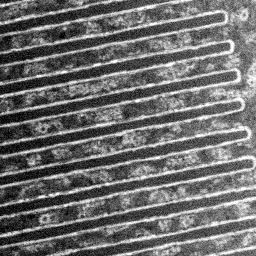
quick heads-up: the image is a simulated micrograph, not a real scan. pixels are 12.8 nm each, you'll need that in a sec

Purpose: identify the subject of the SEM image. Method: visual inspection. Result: parallel lines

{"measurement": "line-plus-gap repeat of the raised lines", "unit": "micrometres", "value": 0.381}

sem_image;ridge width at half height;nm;226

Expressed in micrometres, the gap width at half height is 0.151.